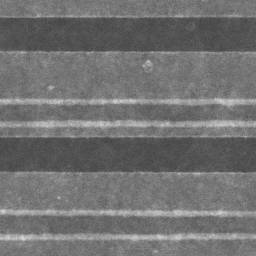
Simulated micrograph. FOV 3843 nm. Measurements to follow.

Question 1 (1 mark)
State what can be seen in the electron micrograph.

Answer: lines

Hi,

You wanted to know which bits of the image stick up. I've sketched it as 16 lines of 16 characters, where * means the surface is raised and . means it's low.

****************
................
................
****************
****************
****************
****************
****************
****************
................
................
****************
****************
****************
****************
****************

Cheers